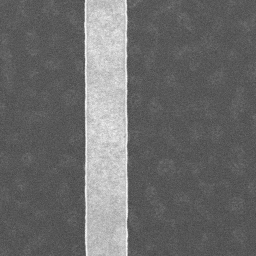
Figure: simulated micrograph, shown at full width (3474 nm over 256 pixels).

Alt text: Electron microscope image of one or a few lines or trenches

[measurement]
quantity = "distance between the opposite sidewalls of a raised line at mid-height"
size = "562 nanometres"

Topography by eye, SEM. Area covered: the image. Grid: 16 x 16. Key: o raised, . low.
.....ooo........
.....ooo........
.....ooo........
.....ooo........
.....ooo........
.....ooo........
.....ooo........
.....ooo........
.....ooo........
.....ooo........
.....ooo........
.....ooo........
.....ooo........
.....ooo........
.....ooo........
.....ooo........